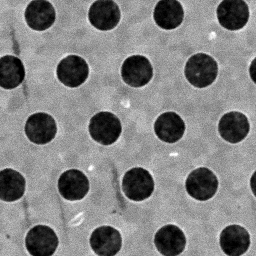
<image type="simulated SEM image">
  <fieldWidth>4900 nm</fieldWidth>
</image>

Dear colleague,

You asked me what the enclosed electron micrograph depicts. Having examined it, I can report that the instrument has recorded a regular array of holes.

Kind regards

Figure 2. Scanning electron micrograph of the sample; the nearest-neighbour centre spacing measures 64.2 px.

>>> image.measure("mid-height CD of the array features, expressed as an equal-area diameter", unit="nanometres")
633